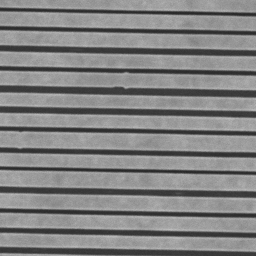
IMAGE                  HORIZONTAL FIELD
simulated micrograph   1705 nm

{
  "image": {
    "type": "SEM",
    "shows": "parallel lines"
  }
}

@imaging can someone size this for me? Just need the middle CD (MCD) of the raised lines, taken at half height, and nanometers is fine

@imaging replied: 95.7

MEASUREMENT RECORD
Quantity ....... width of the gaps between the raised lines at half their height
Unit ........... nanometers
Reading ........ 38.3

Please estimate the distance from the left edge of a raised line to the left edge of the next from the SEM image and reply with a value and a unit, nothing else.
134 nm